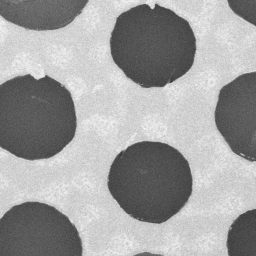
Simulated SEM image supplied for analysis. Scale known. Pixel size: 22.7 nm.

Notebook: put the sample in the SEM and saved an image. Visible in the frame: holes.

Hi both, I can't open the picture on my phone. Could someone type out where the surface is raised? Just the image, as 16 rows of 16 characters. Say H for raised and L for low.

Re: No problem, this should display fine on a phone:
LLLLLHHHLLHHHHLL
HLLLHHHLLLLLHHHH
HHHHHHHLLLLLHHHH
HHHHHHHLLLLLHHHH
HHHHHHHHLLLLHHHH
LLLLHHHHHHHHHHLL
LLLLLHHHHHHHHHLL
LLLLLHHHHHHHHLLL
LLLLLHHHHHHHHHLL
HLLLHHHHLLLHHHHL
HHHHHHHLLLLLHHHH
HHHHHHHLLLLLHHHH
HHHHHHHLLLLLHHHH
LLLLHHHHLLLHHHHL
LLLLLHHHHHHHHHLL
LLLLLHHHHHHHHHLL